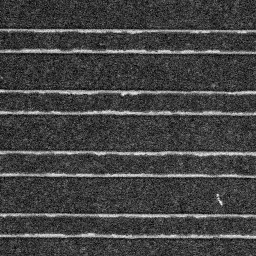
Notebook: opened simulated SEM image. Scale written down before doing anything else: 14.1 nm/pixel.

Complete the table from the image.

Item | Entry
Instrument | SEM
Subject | one or a few lines or trenches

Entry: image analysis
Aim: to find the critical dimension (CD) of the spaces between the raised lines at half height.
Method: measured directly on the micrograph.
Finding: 0.554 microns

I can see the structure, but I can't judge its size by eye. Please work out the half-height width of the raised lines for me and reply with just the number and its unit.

0.309 um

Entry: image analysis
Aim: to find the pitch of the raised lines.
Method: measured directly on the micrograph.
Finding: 868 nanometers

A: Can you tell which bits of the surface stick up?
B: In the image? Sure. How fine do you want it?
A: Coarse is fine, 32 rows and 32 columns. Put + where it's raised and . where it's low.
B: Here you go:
................................
................................
................................
................................
++++++++++++++++++++++++++++++++
++++++++++++++++++++++++++++++++
...........++++..+++++++....++++
................................
................................
................................
................................
+++++++++.+.++.++....+..........
++++++++++++++++++++++++++++++++
++++++++++++++++++++++++++++++++
................................
................................
................................
................................
................................
++++++++++++++++++++++++++++++++
++++++++++++++++++++++++++++++++
++++++++++++++++++++++++++++++++
................................
................................
................................
................................
................................
++++++++++++++++++++++++++++++++
++++++++++++++++++++++++++++++++
...+.++++....+++++++++++++++++++
................................
................................